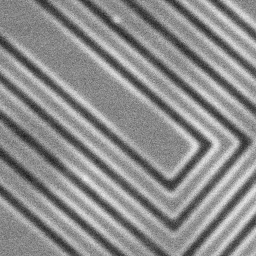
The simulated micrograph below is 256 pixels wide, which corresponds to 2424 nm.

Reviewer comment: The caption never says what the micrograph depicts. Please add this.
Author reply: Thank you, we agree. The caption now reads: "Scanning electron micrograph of groups of lines, slits or small figures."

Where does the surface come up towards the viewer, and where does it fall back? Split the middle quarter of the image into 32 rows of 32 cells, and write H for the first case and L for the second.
HHHHHHHHHHHLLLLLHHHHHHLLLLHHHHHH
HHHHHHHHHHHHLLLLLHHHHHHLLLLLHHHH
HHHHHHHHHHHHHLLLLLHHHHHHLLLLLHHH
HHHHHHHHHHHHHHLLLLLHHHHHHLLLLLHH
HHHHHHHHHHHHHHHLLLLLLHHHHHLLLLLH
HHHHHHHHHHHHHHHHLLLLLHHHHHHLLLLL
LHHHHHHHHHHHHHHHHHLLLLLHHHHHLLLL
LLHHHHHHHHHHHHHHHHHLLLLLHHHHHHLL
LLLHHHHHHHHHHHHHHHHHLLLLLHHHHHHL
LLLLLHHHHHHHHHHHHHHHHLLLLLHHHHHH
HLLLLLHHHHHHHHHHHHHHHHLLLLLHHHHH
HHLLLLLHHHHHHHHHHHHHHHHHLLLLLHHH
HHHLLLLLHHHHHHHHHHHHHHHHHLLLLLHH
HHHHLLLLLHHHHHHHHHHHHHHHHHLLLLLH
HHHHHLLLLLHHHHHHHHHHHHHHHHHLLLLL
LHHHHHLLLLLHHHHHHHHHHHHHHHHHLLLL
LLHHHHHLLLLLHHHHHHHHHHHHHHHHHLLL
LLLHHHHHHLLLLLHHHHHHHHHHHHHHHHLL
LLLLHHHHHHLLLLLHHHHHHHHHHHHHHHHL
LLLLLHHHHHHLLLLLHHHHHHHHHHHHHHHH
HLLLLLHHHHHHLLLLLHHHHHHHHHHHHHHH
HHHLLLLLHHHHHLLLLLHHHHHHHHHHHHHH
HHHHLLLLLHHHHHLLLLLHHHHHHHHHHHHH
HHHHHLLLLLHHHHHHLLLLLHHHHHHHHHHL
HHHHHHLLLLLHHHHHHLLLLLHHHHHHHHLL
LHHHHHHLLLLLHHHHHHLLLLLHHHHHHLLL
LLHHHHHHLLLLLHHHHHHLLLLLHHHHLLLL
LLLLHHHHHLLLLLHHHHHHHLLLLHHHLLLL
LLLLLHHHHHLLLLLLHHHHHLLLLLLLLLLH
HLLLLLHHHHHHLLLLLHHHHHHLLLLLLLHH
HHLLLLLHHHHHHLLLLLHHHHHHLLLLLHHH
HHHLLLLLHHHHHHLLLLLHHHHHHLLLHHHH